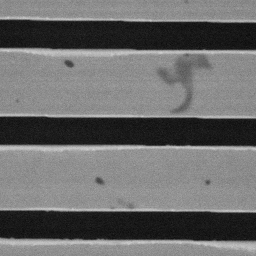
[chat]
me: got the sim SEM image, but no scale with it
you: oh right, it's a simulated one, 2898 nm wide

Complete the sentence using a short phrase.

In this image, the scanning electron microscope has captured lines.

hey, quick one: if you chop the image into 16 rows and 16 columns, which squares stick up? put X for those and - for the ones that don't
XXXXXXXXXXXXXXXX
----------------
----------------
XXXXXXXXXXXXXXXX
XXXXXXXXXXXXXXXX
XXXXXXXXXXXXXXXX
XXXXXXXXXXXXXXXX
----------------
----------------
XXXXXXXXXXXXXXXX
XXXXXXXXXXXXXXXX
XXXXXXXXXXXXXXXX
XXXXXXXXXXXXXXXX
----------------
----------------
XXXXXXXXXXXXXXXX